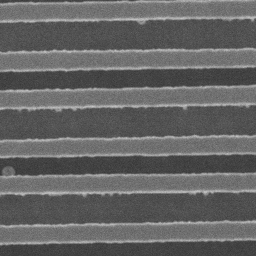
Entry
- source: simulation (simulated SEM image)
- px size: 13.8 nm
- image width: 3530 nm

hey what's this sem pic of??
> lines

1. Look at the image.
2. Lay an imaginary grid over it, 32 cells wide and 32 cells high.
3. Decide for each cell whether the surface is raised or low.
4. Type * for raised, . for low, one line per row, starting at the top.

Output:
********************************
********************************
************....................
................................
................................
................................
.*******************************
********************************
***************************.....
................................
................................
********************************
********************************
**********......................
................................
................................
................................
...*****************************
********************************
************....................
................................
................................
********************************
********************************
................................
................................
................................
................................
********************************
********************************
*...............................
................................